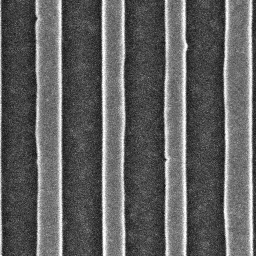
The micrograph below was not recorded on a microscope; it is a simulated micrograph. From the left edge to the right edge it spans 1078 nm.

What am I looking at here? one or a few lines or trenches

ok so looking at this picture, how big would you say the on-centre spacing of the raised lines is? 63.1 pixels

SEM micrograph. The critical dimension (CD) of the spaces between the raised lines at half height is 0.175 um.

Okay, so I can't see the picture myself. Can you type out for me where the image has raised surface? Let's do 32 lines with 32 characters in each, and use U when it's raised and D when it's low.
DDDDDUUDDDDDDUUDDDDDDUUDDDDDUUUD
DDDDDUUDDDDDDUUDDDDDDUUDDDDDUUUD
DDDDDUUUDDDDDUUDDDDDDUUDDDDDUUUD
DDDDDUUUDDDDDUUDDDDDDUUDDDDDUUUD
DDDDDUUUDDDDDUUDDDDDDUUDDDDDUUUD
DDDDDUUUDDDDDUUUDDDDDUUDDDDDUUUD
DDDDDUUUDDDDDUUUDDDDDUUDDDDDUUUD
DDDDDUUUDDDDDUUUDDDDDUUDDDDDUUUD
DDDDDUUUDDDDDUUDDDDDDUUDDDDDUUUD
DDDDDUUUDDDDDUUDDDDDDUUDDDDDUUUD
DDDDDUUUDDDDDUUDDDDDDUUDDDDDUUUD
DDDDDUUUDDDDDUUDDDDDDUUDDDDDUUUD
DDDDDUUUDDDDDUUDDDDDDUUDDDDDUUUD
DDDDDUUUDDDDDUUDDDDDDUUDDDDDUUUD
DDDDDUUUDDDDDUUUDDDDDUUDDDDDUUUD
DDDDDUUUDDDDDUUUDDDDDUUDDDDDUUUD
DDDDDUUUDDDDDUUDDDDDDUUDDDDDUUUD
DDDDDUUUDDDDDUUDDDDDDUUDDDDDUUUD
DDDDDUUUDDDDDUUDDDDDDUUDDDDDUUUD
DDDDDUUUDDDDDUUDDDDDDUUDDDDDUUUD
DDDDDUUUDDDDDUUDDDDDDUUDDDDDUUUD
DDDDDUUUDDDDDUUDDDDDDUUDDDDDUUUD
DDDDDUUUDDDDDUUDDDDDDUUDDDDDUUUD
DDDDDUUUDDDDDUUDDDDDDUUDDDDDUUUD
DDDDDUUUDDDDDUUDDDDDDUUDDDDDUUUD
DDDDDUUUDDDDDUUDDDDDDUUDDDDDUUUD
DDDDDUUUDDDDDUUDDDDDDUUDDDDDUUUD
DDDDDUUUDDDDDUUDDDDDDUUDDDDDUUUD
DDDDDUUUDDDDDUUDDDDDDUUDDDDDUUUD
DDDDDUUUDDDDDUUDDDDDDUUDDDDDUUUD
DDDDDUUUDDDDDUUDDDDDDUUDDDDDUUUD
DDDDDUUUDDDDDUUDDDDDDUUDDDDDUUUD